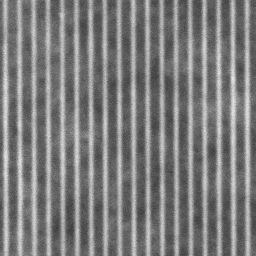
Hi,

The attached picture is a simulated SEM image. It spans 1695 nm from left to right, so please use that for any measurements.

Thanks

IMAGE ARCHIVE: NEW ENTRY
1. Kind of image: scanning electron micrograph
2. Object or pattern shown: parallel lines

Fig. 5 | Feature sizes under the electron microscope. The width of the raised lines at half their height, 0.0174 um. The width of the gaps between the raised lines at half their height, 76.2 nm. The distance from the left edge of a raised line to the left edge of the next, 94.2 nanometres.